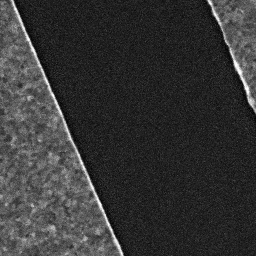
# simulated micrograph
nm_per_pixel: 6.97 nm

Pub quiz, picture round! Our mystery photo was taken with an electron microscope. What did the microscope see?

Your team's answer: one or a few lines or trenches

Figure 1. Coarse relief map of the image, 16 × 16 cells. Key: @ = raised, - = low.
@------------@@@
@-------------@@
@@------------@@
@@-------------@
@@@------------@
@@@------------@
@@@@------------
@@@@------------
@@@@------------
@@@@@-----------
@@@@@-----------
@@@@@@----------
@@@@@@----------
@@@@@@@---------
@@@@@@@---------
@@@@@@@---------